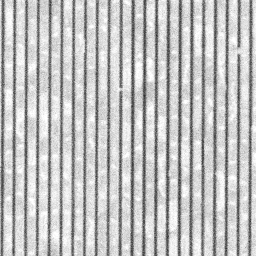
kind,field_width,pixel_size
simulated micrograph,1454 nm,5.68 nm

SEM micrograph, parallel lines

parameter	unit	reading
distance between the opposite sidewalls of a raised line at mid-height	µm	0.0462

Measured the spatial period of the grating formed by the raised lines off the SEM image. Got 0.0671 microns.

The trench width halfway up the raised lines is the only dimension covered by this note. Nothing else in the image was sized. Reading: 20.6 nm